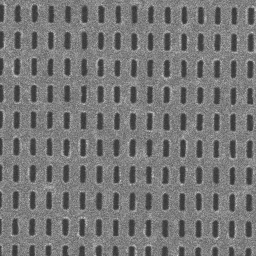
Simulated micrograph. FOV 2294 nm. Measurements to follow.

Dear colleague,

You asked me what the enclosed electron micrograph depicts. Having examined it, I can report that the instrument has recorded a regular array of holes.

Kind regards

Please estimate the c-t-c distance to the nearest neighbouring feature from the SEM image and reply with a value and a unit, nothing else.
146 nanometers